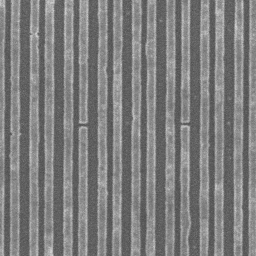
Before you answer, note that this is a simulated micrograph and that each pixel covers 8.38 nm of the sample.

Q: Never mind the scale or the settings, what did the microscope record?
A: parallel lines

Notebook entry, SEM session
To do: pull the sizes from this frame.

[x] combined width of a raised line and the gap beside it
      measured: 144 nm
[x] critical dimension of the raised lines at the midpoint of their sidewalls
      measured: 0.0649 µm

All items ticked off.